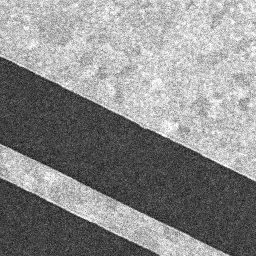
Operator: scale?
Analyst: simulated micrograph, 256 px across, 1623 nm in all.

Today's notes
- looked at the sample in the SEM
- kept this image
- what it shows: one or a few lines or trenches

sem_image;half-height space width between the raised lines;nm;503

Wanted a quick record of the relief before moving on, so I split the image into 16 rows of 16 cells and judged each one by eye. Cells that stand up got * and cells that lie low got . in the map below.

****************
****************
****************
****************
..**************
....************
......**********
........********
..........******
*...........****
***...........**
.****...........
...****.........
.....****.......
.......****.....
.........****...